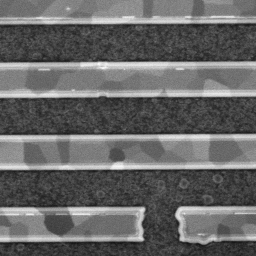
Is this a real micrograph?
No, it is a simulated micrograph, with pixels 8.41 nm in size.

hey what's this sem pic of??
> one or a few lines or trenches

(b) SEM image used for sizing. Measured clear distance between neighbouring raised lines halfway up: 348 nanometers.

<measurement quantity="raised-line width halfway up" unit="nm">265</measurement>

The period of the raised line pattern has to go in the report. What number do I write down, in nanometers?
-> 609